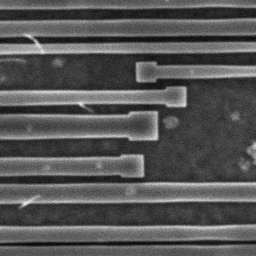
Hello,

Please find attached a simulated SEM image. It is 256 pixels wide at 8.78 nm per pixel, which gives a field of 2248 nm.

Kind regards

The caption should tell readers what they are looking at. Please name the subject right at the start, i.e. groups of lines, slits or small figures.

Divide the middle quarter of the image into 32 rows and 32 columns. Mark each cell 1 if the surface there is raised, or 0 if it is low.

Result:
00000000000000000011111000000000
00000000000000000011111111111111
00000000000000000011111111111111
00000000000000000011111000000000
00000000000000000000000000000000
00000000000000000000000000000000
00000000000000000000000001111100
11111111111111111111111111111100
11111111111111111111111111111100
11111111111111111111111111111100
00000000000000000000000000111100
00000000000000000000000000000000
00000000000000001111111000000000
11111111111111111111111000000000
11111111111111111111111000000000
11111111111111111111111000000000
11111111111111111111111000000000
11111111111111111111111000000000
00000000000000001111111000000000
00000000000000000000000000000000
00000000000000000000000000000000
00000000000000000000000000000000
00000000000000000000000000000000
00000011111111111111000000000000
11111111111111111111000000000000
11111111111111111111000000000000
11111111111111111111000000000000
11111111111111111111000000000000
00000000000000000000000000000000
00000000000000000000000000000000
11111111111111111111111111111111
11111111111111111111111111111111